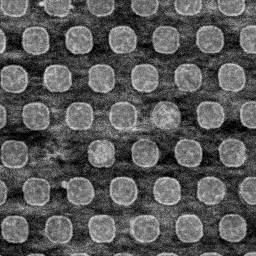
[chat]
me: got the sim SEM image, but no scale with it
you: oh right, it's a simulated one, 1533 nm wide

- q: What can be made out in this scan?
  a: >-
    a regular array of raised bodies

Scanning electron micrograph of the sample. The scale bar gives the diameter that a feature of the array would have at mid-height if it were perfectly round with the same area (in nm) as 163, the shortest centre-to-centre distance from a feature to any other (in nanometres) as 259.